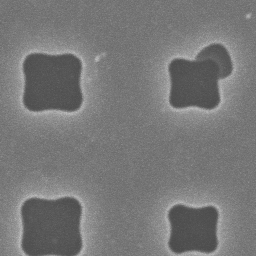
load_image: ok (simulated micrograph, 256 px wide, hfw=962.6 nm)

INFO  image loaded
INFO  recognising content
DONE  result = holes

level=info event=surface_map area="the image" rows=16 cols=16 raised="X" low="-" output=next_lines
XXXXXXXXXXXXXXXX
XXXXXXXXXXXXXXXX
XXXXXXXXXXXXXXXX
XX---XXXXXXX--XX
X----XXXXXX---XX
X----XXXXXX---XX
XX---XXXXXX---XX
XXXXXXXXXXXXXXXX
XXXXXXXXXXXXXXXX
XXXXXXXXXXXXXXXX
XXXXXXXXXXXXXXXX
XXXXXXXXXXXXXXXX
XX---XXXXXXXXXXX
X----XXXXXX---XX
X----XXXXXX---XX
X----XXXXXX--XXX